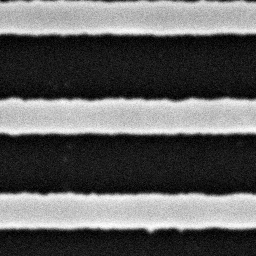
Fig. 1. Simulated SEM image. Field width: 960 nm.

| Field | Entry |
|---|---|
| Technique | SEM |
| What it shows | lines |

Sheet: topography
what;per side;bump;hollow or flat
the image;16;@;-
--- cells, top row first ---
@@@@@@@@@@@@@@@@
@@@@@@@@@@@@@@@@
----------------
----------------
----------------
----------------
@@@@@@@@@@@@@@@@
@@@@@@@@@@@@@@@@
----------------
----------------
----------------
----------------
@@@@@@@@@@@@@@@@
@@@@@@@@@@@@@@@@
----------------
----------------